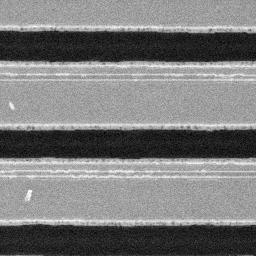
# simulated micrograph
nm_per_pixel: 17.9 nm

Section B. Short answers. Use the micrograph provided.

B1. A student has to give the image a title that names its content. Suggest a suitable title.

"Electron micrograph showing lines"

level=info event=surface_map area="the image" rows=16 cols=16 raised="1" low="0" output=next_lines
1111111111111111
1111111111111111
0000000000000000
0000000000000000
1111111111111111
1111111111111111
1111111111111111
1111111111111111
0000000000000000
0000000000000000
1111111111111111
1111111111111111
1111111111111111
1111111111111111
0000000000000000
0000000000000000